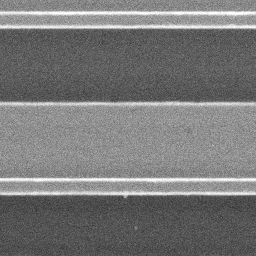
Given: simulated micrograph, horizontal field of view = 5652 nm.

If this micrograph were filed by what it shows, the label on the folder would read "lines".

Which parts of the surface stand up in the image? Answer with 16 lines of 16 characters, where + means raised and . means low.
++++++++++++++++
++++++++++++++++
................
................
................
................
.....++.++......
++++++++++++++++
++++++++++++++++
++++++++++++++++
++++++++++++++++
++++++++++++++++
................
................
................
................